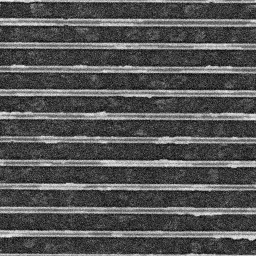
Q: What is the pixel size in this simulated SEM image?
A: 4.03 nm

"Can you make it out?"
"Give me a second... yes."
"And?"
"parallel lines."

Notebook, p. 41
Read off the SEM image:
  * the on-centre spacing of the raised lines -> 94.8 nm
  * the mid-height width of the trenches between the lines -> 74.6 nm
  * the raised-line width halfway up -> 21.2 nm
